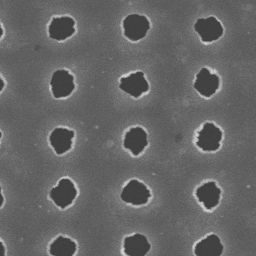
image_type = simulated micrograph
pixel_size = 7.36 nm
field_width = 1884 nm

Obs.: a regular array of holes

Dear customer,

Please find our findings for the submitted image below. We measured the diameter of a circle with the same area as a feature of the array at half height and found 0.182 microns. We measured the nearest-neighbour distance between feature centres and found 403 nanometers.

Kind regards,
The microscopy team